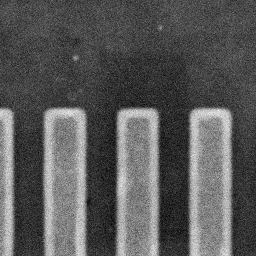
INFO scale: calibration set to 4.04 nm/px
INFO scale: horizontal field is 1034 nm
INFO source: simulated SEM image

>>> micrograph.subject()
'wiring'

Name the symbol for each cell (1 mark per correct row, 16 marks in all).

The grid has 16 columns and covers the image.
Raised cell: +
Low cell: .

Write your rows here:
................
................
................
................
................
................
................
+..++...++..++..
+..++...++..++..
+..++...++..++..
+..++...++..++..
+..++...++..++..
+..++...++..++..
+..++...++..++..
+..++...++..++..
+..++...++..++..